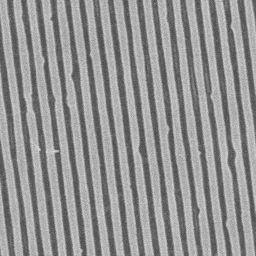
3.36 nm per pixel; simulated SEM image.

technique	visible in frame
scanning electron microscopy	parallel lines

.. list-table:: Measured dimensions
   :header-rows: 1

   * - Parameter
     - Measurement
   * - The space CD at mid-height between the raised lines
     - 23.7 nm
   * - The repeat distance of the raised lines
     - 48.2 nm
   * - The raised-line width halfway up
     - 24.1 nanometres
